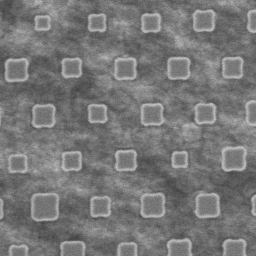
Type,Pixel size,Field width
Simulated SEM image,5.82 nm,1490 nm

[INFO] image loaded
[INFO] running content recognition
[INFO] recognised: a regular array of raised bodies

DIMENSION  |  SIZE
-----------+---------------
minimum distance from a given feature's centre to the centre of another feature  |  306 nm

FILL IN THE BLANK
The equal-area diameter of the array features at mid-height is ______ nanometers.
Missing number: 134